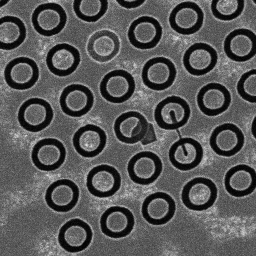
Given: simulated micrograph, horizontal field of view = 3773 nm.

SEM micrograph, a regular array of ring-shaped grooves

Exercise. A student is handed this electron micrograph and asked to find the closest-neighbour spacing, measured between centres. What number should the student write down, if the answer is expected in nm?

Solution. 625